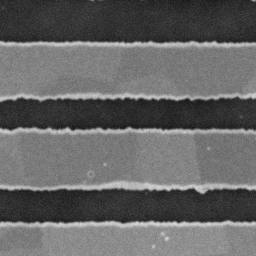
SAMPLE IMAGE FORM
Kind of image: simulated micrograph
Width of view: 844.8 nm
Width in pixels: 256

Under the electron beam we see lines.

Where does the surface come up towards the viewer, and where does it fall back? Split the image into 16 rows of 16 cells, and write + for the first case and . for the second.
................
................
................
++++++++++++++++
++++++++++++++++
++++++++++++++++
................
................
++++++++++++++++
++++++++++++++++
++++++++++++++++
++++++++++++++++
................
................
++++++++++++++++
++++++++++++++++